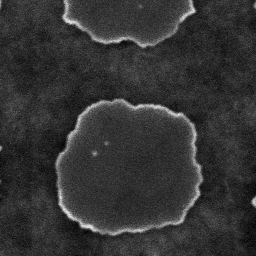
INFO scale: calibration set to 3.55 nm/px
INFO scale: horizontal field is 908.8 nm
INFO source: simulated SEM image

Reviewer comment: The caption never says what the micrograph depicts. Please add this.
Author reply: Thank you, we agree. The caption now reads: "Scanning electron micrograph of raised bodies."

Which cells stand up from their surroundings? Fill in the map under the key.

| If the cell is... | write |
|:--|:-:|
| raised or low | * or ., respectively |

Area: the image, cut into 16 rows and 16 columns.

....********....
....*******.....
......****......
................
................
................
......**........
.....*******....
....********....
....********....
....********....
....********....
....********....
....********....
......**........
................